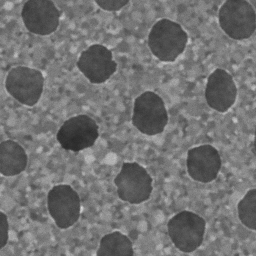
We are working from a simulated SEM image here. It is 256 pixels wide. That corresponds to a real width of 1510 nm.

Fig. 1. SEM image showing a regular array of holes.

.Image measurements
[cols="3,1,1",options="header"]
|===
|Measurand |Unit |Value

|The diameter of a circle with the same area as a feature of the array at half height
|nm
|236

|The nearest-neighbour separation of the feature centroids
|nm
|424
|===